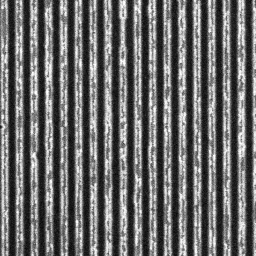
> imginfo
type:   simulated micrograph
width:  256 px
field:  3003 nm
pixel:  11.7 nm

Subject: parallel lines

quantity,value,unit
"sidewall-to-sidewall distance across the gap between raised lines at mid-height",90.9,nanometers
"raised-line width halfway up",80.7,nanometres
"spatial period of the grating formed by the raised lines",0.174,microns